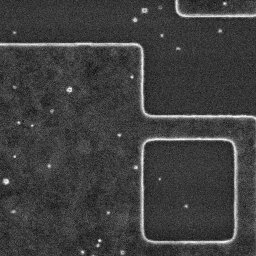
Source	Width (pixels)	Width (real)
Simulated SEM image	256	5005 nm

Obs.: wiring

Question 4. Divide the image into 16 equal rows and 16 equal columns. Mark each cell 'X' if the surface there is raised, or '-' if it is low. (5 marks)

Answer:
-----------XXXXX
----------------
----------------
XXXXXXXXX-------
XXXXXXXXX-------
XXXXXXXXX-------
XXXXXXXXX-------
XXXXXXXXXXXXXXXX
XXXXXXXXXXXXXXXX
XXXXXXXXX------X
XXXXXXXXX------X
XXXXXXXXX------X
XXXXXXXXX------X
XXXXXXXXX------X
XXXXXXXXX------X
XXXXXXXXXXXXXXXX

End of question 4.